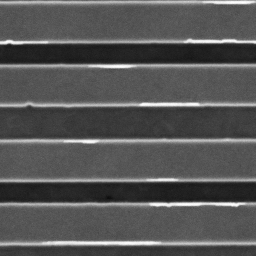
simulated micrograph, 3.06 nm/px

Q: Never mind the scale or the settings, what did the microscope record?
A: one or a few lines or trenches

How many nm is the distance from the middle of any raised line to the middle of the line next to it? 206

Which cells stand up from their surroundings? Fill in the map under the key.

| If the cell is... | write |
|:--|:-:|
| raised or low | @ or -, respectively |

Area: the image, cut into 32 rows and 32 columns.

@@@@@@@@@@@@@@@@@@@@@@@@@@@@@@@@
@@@@@@@@@@@@@@@@@@@@@@@@@@@@@@@@
@@@@@@@@@@@@@@@@@@@@@@@@@@@@@@@@
@@@@@@@@@@@@@@@@@@@@@@@@@@@@@@@@
@@@@@@@@@@@@@@@@@@@@@@@@@@@@@@@@
--------------------------------
--------------------------------
--------------------------------
@@@@@@@@@@@@@@@@@@@@@@@@@@@@@@@@
@@@@@@@@@@@@@@@@@@@@@@@@@@@@@@@@
@@@@@@@@@@@@@@@@@@@@@@@@@@@@@@@@
@@@@@@@@@@@@@@@@@@@@@@@@@@@@@@@@
@@@@@@@@@@@@@@@@@@@@@@@@@@@@@@@@
--------------------------------
--------------------------------
--------------------------------
--------------------------------
--@@@@@@@@@@@-@@@@@@@@@--@-@@@@@
@@@@@@@@@@@@@@@@@@@@@@@@@@@@@@@@
@@@@@@@@@@@@@@@@@@@@@@@@@@@@@@@@
@@@@@@@@@@@@@@@@@@@@@@@@@@@@@@@@
@@@@@@@@@@@@@@@@@@@@@@@@@@@@@@@@
@@@@@@@@@@@@@@@@@@@@@@@@@@@@@@@@
--------------------------------
--------------------------------
@@@@@@@@@@@@@@@@@@@@@@@@@@@@@@@@
@@@@@@@@@@@@@@@@@@@@@@@@@@@@@@@@
@@@@@@@@@@@@@@@@@@@@@@@@@@@@@@@@
@@@@@@@@@@@@@@@@@@@@@@@@@@@@@@@@
@@@@@@@@@@@@@@@@@@@@@@@@@@@@@@@@
@@@@@@@@@@@@@@@@@@@@@@@@@@@@@@@@
--------------------------------